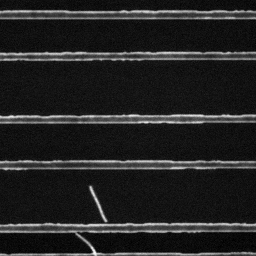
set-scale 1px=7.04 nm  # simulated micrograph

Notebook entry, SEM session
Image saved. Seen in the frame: lines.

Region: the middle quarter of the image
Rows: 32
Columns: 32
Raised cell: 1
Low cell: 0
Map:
00000000000000000000000000000000
00000000000000000000000000000000
00000000000000000000000000000000
00000000000000000000000000000000
00000000000000000000000000000000
00000000000000000000000000000000
00000000000000000000000000000000
00000000000000000000000000000000
00000000000000000000000000000000
00000000000000000000000000000000
00000000000000000000000000000000
00000000000000000000000000000000
00000000000000000000000000000000
11111111111111111111111111111111
11111111111111111111101111111111
00000000000000000000000000000000
00000000000000000000000000000000
00000000000000000000000000000000
00000000000000000000000000000000
00000000000000000000000000000000
00000000000000000000000000000000
00000000000000000000000000000000
00000000000000000000000000000000
00000000000000000000000000000000
11111111111111111111111111111111
11111111111111111111111111111111
00000000000000000000000000000000
00000000000000000000000000000000
00000000000000000000000000000000
00000000000000000000000000000000
00000000000000000000000000000000
00000000000000000000000000000000